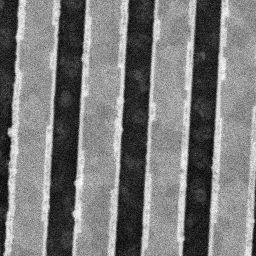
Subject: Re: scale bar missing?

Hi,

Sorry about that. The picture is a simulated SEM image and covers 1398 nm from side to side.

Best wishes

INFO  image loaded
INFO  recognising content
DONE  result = one or a few lines or trenches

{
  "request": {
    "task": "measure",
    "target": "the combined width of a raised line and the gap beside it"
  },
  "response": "372 nm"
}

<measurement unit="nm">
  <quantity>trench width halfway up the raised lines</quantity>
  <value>161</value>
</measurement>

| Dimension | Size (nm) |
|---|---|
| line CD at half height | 215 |